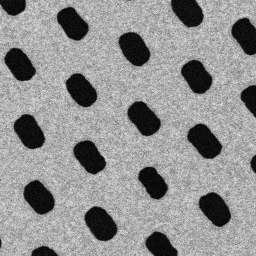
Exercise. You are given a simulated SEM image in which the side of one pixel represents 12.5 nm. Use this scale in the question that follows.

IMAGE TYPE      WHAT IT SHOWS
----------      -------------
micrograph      a regular array of holes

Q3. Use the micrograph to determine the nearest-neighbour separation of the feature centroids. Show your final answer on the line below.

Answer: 65.5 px